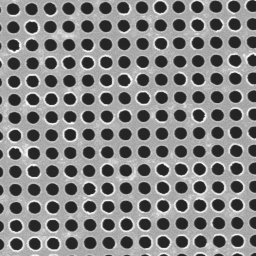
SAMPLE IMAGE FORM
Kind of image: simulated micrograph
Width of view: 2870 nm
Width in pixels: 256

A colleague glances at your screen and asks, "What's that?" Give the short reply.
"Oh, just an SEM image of a regular array of holes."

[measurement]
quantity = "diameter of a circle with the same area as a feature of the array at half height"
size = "0.141 µm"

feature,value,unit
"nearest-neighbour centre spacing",201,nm